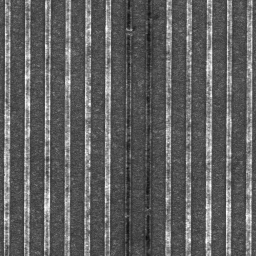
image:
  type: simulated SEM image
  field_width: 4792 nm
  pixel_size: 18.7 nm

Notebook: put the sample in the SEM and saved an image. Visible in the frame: parallel lines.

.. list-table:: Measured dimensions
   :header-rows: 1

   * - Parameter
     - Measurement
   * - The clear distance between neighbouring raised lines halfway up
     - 295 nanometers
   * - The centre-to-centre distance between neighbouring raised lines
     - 378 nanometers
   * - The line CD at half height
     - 81.9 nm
